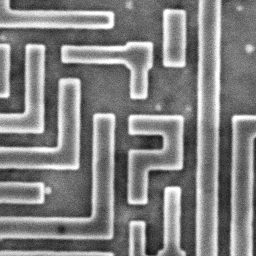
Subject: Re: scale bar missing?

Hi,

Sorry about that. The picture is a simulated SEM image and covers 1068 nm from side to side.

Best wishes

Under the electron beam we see wiring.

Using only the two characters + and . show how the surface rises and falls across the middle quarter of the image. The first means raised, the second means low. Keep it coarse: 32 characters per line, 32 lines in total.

................++++++..........
.................++++...........
.................++++...........
.................++++...........
++++.............++++...........
++++.............++++...........
++++.............++++...........
++++.............++++...........
++++............................
++++............................
++++............................
++++............................
++++............................
++++...++++++...++++++++++++++..
++++...++++++...++++++++++++++..
++++...++++++...++++++++++++++..
++++...+++++....++++++++++++++..
++++...+++++.....+.+++++++++++..
++++...+++++.............++++...
++++...+++++.............++++...
++++...+++++.............+++++..
++++...+++++............++++++..
++++...+++++....++++++++++++++..
++++...+++++....++++++++++++++..
++++...+++++....+++++++++++++...
++++...+++++....+++++++++++++...
.......+++++....++++++..........
.......+++++....+++++...........
.......+++++....+++++...........
.......+++++....+++++...........
.......+++++....+++++...........
.......+++++....+++++....++++...